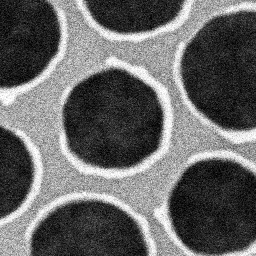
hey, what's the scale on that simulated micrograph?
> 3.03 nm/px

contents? holes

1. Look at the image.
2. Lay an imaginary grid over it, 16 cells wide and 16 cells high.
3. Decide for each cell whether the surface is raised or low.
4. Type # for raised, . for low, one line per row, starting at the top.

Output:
...##......#####
....##....###...
....########....
...########.....
...###..###.....
#####....###....
####......##....
####......###...
.###......######
..##......######
..####..####...#
..#########.....
..###.#####.....
###.....###.....
##.......##.....
##.......###...#